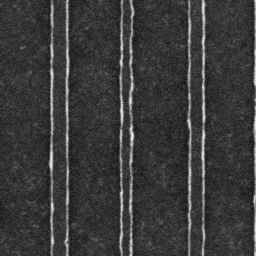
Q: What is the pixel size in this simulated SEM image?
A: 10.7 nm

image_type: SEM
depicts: one or a few lines or trenches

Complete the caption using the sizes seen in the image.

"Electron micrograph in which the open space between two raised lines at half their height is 581 nanometers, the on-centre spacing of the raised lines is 68.4 px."